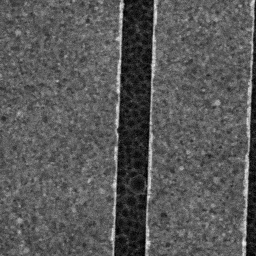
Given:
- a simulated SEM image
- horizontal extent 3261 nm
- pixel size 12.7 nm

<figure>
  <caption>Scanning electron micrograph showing one or a few lines or trenches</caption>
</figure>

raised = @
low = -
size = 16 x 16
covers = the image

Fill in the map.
@@@@@@@@--@@@@@@
@@@@@@@@--@@@@@@
@@@@@@@@--@@@@@@
@@@@@@@@--@@@@@@
@@@@@@@@--@@@@@@
@@@@@@@--@@@@@@@
@@@@@@@--@@@@@@@
@@@@@@@--@@@@@@@
@@@@@@@--@@@@@@@
@@@@@@@--@@@@@@@
@@@@@@@--@@@@@@@
@@@@@@@-@@@@@@@-
@@@@@@@--@@@@@@-
@@@@@@@--@@@@@@-
@@@@@@@--@@@@@@-
@@@@@@@--@@@@@@-